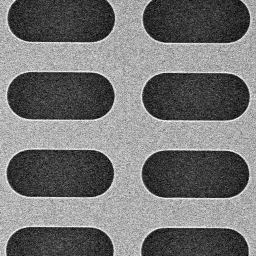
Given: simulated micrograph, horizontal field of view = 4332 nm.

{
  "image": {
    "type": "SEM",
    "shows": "groups of lines, slits or small figures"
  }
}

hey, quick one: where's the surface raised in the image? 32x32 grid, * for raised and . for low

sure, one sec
**............*****............*
*.............****.............*
*.............****.............*
*.............****.............*
**...........******...........**
*************************...****
********************************
********************************
********************************
**...........******...........**
*.............****.............*
*.............****.............*
*.............****.............*
*.............****.............*
**...........******...........**
********************************
********************************
********************************
********************************
**...........******...........**
*.............****.............*
*.............****.............*
*.............****.............*
*.............****.............*
***.........********.........***
********************************
********************************
********************************
***.........*********.......****
*.............****............**
*.............****.............*
*.............****.............*